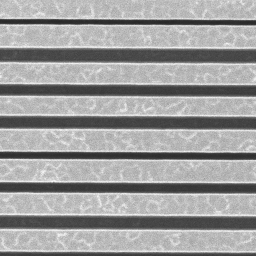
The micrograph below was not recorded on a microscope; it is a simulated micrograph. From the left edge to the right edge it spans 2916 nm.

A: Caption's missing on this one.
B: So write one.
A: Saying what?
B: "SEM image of parallel lines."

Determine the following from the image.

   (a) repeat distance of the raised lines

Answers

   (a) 388 nm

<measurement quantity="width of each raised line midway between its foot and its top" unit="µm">0.268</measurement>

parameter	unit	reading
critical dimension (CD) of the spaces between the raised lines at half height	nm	130